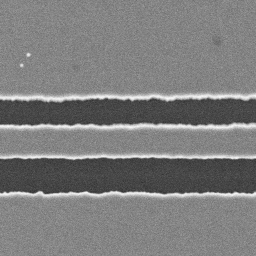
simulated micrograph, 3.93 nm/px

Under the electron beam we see lines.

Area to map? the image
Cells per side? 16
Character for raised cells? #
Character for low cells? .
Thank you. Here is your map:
################
################
################
################
################
################
................
................
################
################
................
................
################
################
################
################